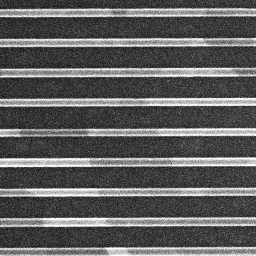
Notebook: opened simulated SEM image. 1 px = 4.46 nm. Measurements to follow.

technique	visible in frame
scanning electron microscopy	parallel lines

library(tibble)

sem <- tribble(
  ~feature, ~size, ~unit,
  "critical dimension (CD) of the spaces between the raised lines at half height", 22.8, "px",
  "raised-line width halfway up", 31.2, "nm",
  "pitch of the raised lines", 133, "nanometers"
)